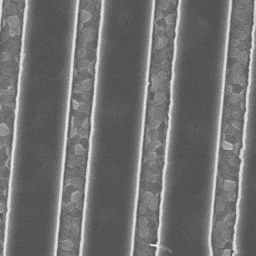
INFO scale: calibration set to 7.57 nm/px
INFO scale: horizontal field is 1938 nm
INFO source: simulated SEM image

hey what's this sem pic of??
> one or a few lines or trenches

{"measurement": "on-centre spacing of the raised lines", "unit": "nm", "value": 577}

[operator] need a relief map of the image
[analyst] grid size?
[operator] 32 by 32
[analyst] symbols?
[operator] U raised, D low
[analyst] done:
DDDUUUUUUUDDDUUUUUUDDDUUUUUUUDDD
DDDUUUUUUUDDDUUUUUUDDDUUUUUUUDDD
DDDUUUUUUUDDDUUUUUUDDDUUUUUUUDDD
DDDUUUUUUDDDDUUUUUUDDDUUUUUUUDDD
DDDUUUUUUDDDUUUUUUUDDDUUUUUUDDDD
DDDUUUUUUDDDUUUUUUUDDDUUUUUUDDDD
DDDUUUUUUDDDUUUUUUUDDDUUUUUUDDDU
DDDUUUUUUDDDUUUUUUUDDDUUUUUUDDDU
DDDUUUUUUDDDUUUUUUUDDDUUUUUUDDDU
DDUUUUUUUDDDUUUUUUDDDDUUUUUUDDDU
DDUUUUUUUDDDUUUUUUDDDUUUUUUUDDDU
DDUUUUUUUDDDUUUUUUDDDUUUUUUUDDDU
DDUUUUUUUDDDUUUUUUDDDUUUUUUUDDDU
DDUUUUUUUDDDUUUUUUDDDUUUUUUUDDDU
DDUUUUUUDDDDUUUUUUDDDUUUUUUUDDDU
DDUUUUUUDDDUUUUUUUDDDUUUUUUUDDDU
DDUUUUUUDDDUUUUUUUDDDUUUUUUDDDDU
DDUUUUUUDDDUUUUUUUDDDUUUUUUDDDUU
DDUUUUUUDDDUUUUUUUDDDUUUUUUDDDUU
DDUUUUUUDDDUUUUUUUDDDUUUUUUDDDUU
DUUUUUUUDDDUUUUUUDDDDUUUUUUDDDUU
DUUUUUUUDDDUUUUUUDDDUUUUUUUDDDUU
DUUUUUUUDDDUUUUUUDDDUUUUUUUDDDUU
DUUUUUUUDDDUUUUUUDDDUUUUUUUDDDUU
DUUUUUUUDDDUUUUUUDDDUUUUUUUDDDUU
DUUUUUUDDDDUUUUUUDDDUUUUUUUDDDUU
DUUUUUUDDDUUUUUUUDDDUUUUUUUDDDUU
DUUUUUUDDDUUUUUUUDDDUUUUUUDDDDUU
DUUUUUUDDDUUUUUUUDDDUUUUUUDDDUUU
DUUUUUUDDDUUUUUUUDDDUUUUUUDDDUUU
DUUUUUUDDDUUUUUUUDDDUUUUUUDDDUUU
DUUUUUUDDDUUUUUUUDDDUUUUUUDDDUUU